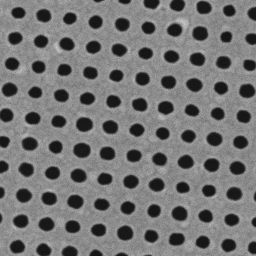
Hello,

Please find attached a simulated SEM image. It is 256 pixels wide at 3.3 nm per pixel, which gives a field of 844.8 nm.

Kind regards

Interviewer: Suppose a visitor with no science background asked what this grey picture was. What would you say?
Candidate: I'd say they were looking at a regular array of holes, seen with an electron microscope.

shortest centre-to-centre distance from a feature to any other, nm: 84.7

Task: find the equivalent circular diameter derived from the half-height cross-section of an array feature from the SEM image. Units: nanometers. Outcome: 43.8